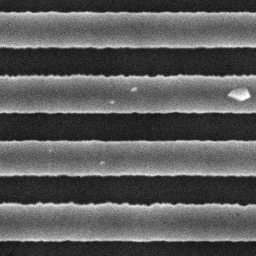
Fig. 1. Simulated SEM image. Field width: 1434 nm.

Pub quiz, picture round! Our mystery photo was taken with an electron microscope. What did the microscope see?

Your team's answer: lines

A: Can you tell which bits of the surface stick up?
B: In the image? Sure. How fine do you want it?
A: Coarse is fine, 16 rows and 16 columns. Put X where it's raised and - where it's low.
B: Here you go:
----------------
XXXXXXXXXXXXXXXX
XXXXXXXXXXXXXXXX
----------------
----------------
XXXXXXXXXXXXXXXX
XXXXXXXXXXXXXXXX
----------------
----------------
XXXXXXXXXXXXXXXX
XXXXXXXXXXXXXXXX
----------------
----------------
XXXXXXXXXXXXXXXX
XXXXXXXXXXXXXXXX
----------------